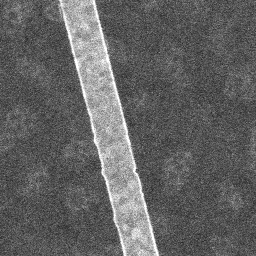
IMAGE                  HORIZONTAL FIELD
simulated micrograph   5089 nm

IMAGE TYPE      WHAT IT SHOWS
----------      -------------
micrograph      one or a few lines or trenches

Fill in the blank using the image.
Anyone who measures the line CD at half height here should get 643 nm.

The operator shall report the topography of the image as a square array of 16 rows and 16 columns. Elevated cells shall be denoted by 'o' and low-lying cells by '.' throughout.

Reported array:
...ooo..........
....oo..........
....ooo.........
.....oo.........
.....oo.........
.....oo.........
.....ooo........
......oo........
......oo........
......oo........
......oo........
.......oo.......
.......oo.......
.......oo.......
.......oo.......
........oo......